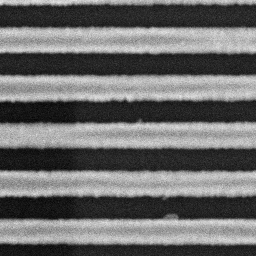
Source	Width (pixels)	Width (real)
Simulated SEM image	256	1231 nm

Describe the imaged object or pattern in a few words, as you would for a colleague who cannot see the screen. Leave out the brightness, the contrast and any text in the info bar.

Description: lines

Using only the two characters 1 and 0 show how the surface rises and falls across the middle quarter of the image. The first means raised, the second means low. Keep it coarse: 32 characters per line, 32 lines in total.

00000000000000000000000000000000
00000000000000000000000000000000
00000000000000000000000000000000
11111111111111111111111111111111
11111111111111111111111111111111
11111111111111111111111111111111
11111111111111111111111111111111
11111111111111111111111111111111
11111111111111111111111111111111
00000000000000000000000000000000
00000000000000000000000000000000
00000000000000000000000000000000
00000000000000000000000000000000
00000000000000000000000000000000
00000000000000000000000000000000
11111111111111111111111111111111
11111111111111111111111111111111
11111111111111111111111111111111
11111111111111111111111111111111
11111111111111111111111111111111
11111111111111111111111111111111
00000000000000000000000000000000
00000000000000000000000000000000
00000000000000000000000000000000
00000000000000000000000000000000
00000000000000000000000000000000
00000000000000000000000000000000
11111111111111111111111111111111
11111111111111111111111111111111
11111111111111111111111111111111
11111111111111111111111111111111
11111111111111111111111111111111